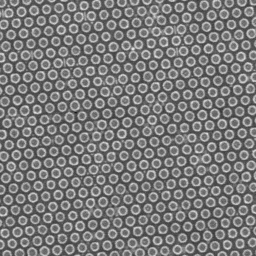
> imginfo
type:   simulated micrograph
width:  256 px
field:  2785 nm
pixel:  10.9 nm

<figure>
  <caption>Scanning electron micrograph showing a regular array of raised bodies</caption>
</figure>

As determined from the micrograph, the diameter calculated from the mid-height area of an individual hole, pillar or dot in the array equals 93.5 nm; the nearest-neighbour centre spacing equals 135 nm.